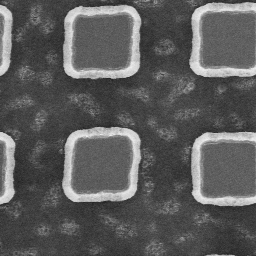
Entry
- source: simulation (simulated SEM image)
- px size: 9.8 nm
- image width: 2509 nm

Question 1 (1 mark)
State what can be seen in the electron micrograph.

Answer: raised bodies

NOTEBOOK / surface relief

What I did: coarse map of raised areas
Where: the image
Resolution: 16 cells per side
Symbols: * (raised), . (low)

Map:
.............***
....*****...****
....*****...****
....****....****
.....***.....***
................
................
................
.....***........
*...*****...****
*...****....****
*...****....****
.............***
................
................
................